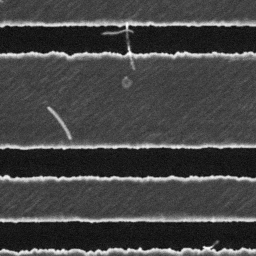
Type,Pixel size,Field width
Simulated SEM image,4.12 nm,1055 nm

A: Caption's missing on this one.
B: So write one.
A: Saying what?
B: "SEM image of lines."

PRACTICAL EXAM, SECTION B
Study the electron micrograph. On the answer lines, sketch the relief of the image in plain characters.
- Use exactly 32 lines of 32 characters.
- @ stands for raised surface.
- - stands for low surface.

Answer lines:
@@@@@@@@@@@@@@@@@@@@@@@@@@@@@@@@
@@@@@@@@@@@@@@@@@@@@@@@@@@@@@@@@
@@@@@@@@@@@@@@@@@@@@@@@@@@@@@@@@
--------------------------------
--------------------------------
--------------------------------
--------------------------------
@@@@@@@@@@@@@@@@@@@@@@@@@@@@@@@@
@@@@@@@@@@@@@@@@@@@@@@@@@@@@@@@@
@@@@@@@@@@@@@@@@@@@@@@@@@@@@@@@@
@@@@@@@@@@@@@@@@@@@@@@@@@@@@@@@@
@@@@@@@@@@@@@@@@@@@@@@@@@@@@@@@@
@@@@@@@@@@@@@@@@@@@@@@@@@@@@@@@@
@@@@@@@@@@@@@@@@@@@@@@@@@@@@@@@@
@@@@@@@@@@@@@@@@@@@@@@@@@@@@@@@@
@@@@@@@@@@@@@@@@@@@@@@@@@@@@@@@@
@@@@@@@@@@@@@@@@@@@@@@@@@@@@@@@@
@@@@@@@@@@@@@@@@@@@@@@@@@@@@@@@@
@@@@@@@@@@@@--@-@@@--@@@@--@----
--------------------------------
--------------------------------
--------------------------------
@@@@@@@@@@@@@@@@@@@@@@@@@@@@@@@@
@@@@@@@@@@@@@@@@@@@@@@@@@@@@@@@@
@@@@@@@@@@@@@@@@@@@@@@@@@@@@@@@@
@@@@@@@@@@@@@@@@@@@@@@@@@@@@@@@@
@@@@@@@@@@@@@@@@@@@@@@@@@@@@@@@@
@@@@@@@@@@@@@@@@@@@@@@@@@@@@@@@@
--------------------------------
--------------------------------
--------------------------------
@@@@@@@@@@@@@@@@@@@@@@@@@@@@@@@@